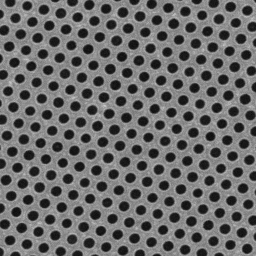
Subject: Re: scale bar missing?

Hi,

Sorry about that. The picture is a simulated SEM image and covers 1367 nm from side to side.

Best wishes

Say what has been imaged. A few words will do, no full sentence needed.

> a regular array of holes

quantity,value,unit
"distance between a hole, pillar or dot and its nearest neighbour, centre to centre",89.5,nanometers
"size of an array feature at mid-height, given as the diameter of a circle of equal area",57.8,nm